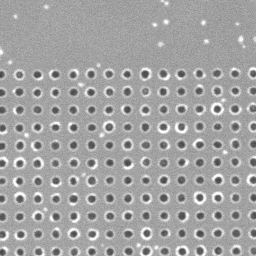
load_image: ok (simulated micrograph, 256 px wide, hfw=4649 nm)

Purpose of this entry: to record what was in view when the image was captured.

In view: a regular array of holes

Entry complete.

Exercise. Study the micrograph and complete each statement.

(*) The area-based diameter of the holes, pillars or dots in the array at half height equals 153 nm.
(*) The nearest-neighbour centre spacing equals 0.318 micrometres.